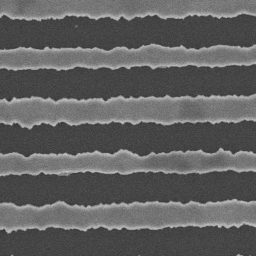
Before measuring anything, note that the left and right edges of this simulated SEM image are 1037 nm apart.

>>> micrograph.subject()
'lines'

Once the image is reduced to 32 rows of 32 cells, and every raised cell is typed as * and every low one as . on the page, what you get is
********************************
********************************
...**...........................
................................
................................
................................
********************************
********************************
*********..*..*.................
................................
................................
................................
********************************
********************************
********************************
.****.*.**..........**..........
................................
................................
................................
***.****************************
********************************
**********.******..*******......
................................
................................
................................
**....**......******************
********************************
********************************
******..****.*******............
................................
................................
................................